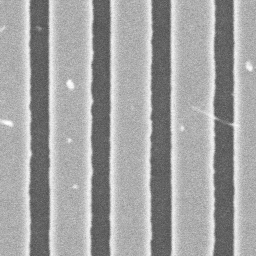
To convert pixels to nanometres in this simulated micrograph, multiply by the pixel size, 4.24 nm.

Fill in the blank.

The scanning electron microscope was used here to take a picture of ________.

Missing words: lines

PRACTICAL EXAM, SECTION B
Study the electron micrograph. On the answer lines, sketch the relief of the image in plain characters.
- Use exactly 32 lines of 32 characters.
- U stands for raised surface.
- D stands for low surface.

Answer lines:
UUUUDDUUUUUUDDUUUUUDDUUUUUUDDUUU
UUUUDDUUUUUUDDUUUUUDDUUUUUUDDUUU
UUUUDDUUUUUUDDUUUUUDDUUUUUUDDUUU
UUUUDDUUUUUDDDUUUUUDDUUUUUUDDUUU
UUUUDDUUUUUUDDUUUUUDDUUUUUUDDUUU
UUUUDDUUUUUUDDUUUUUDDUUUUUUDDUUU
UUUUDDUUUUUUDDUUUUUDDUUUUUUDDUUU
UUUUDDUUUUUUDDUUUUUDDUUUUUUDDUUU
UUUUDDUUUUUDDDUUUUUDDUUUUUUDDUUU
UUUUDDUUUUUDDDUUUUUDDUUUUUUDDUUU
UUUUDDUUUUUDDDUUUUUDDUUUUUUDDUUU
UUUUDDUUUUUDDDUUUUUDDUUUUUUDDUUU
UUUUDDUUUUUUDDUUUUUDDUUUUUUDDUUU
UUUUDDUUUUUDDDUUUUUDDUUUUUUDDUUU
UUUUDDUUUUUDDDUUUUUDDUUUUUUDDUUU
UUUUDDUUUUUDDDUUUUUDDUUUUUUDDUUU
UUUUDDUUUUUDDDUUUUUDDUUUUUUDDUUU
UUUUDDUUUUUDDDUUUUUDDUUUUUUDDUUU
UUUUDDUUUUUDDDUUUUUDDUUUUUUDDUUU
UUUUDDUUUUUDDDUUUUUDDUUUUUUDDUUU
UUUUDDUUUUUDDDUUUUUDDUUUUUUDDUUU
UUUUDDUUUUUUDDUUUUUDDUUUUUUDDUUU
UUUUDDUUUUUDDDUUUUUDDUUUUUUDDUUU
UUUUDDUUUUUDDDUUUUUDDDUUUUUDDUUU
UUUUDDUUUUUDDDUUUUUDDDUUUUUDDUUU
UUUUDDUUUUUDDDUUUUUDDDUUUUUDDUUU
UUUUDDUUUUUDDDUUUUUDDDUUUUUDDUUU
UUUUDDUUUUUDDDUUUUUDDDUUUUUDDUUU
UUUUDDUUUUUDDDUUUUUDDDUUUUUDDUUU
UUUUDDUUUUUDDDUUUUUDDDUUUUUDDUUU
UUUUDDUUUUUDDDUUUUUDDDUUUUUDDUUU
UUUUDDUUUUUDDDUUUUUDDUUUUUUDDUUU